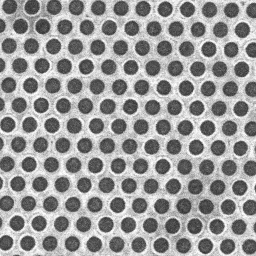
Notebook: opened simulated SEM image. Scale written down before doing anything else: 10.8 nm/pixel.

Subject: a regular array of holes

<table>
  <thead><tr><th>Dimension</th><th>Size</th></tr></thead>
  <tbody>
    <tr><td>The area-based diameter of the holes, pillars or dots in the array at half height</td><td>169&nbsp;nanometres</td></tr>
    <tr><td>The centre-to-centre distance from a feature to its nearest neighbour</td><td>238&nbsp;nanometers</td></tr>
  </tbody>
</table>